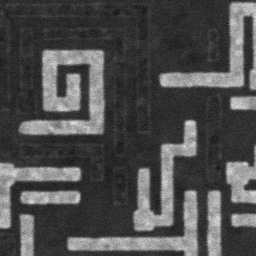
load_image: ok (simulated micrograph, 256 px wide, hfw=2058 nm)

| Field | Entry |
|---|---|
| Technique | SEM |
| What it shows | wiring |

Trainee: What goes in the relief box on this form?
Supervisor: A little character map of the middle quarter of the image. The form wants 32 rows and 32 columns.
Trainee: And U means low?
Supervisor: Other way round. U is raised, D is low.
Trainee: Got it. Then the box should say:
DDDDDDDUUDDDDDDDDDUUUDDDDDDDDDDD
DDDDDDDUUDDDDDDDDDUUUDDDDDDDDDDD
DDDDDDDUUDDDDDDDDDUUUDDDDDDUDDDD
DUUUDDDUUDDDDUUDDDUUUDDDUUUUUUUU
DUUUDDDUUDDDDUUDDDUUUDDDUUUUUUUU
DUUUDDDUUDDDDUUDDDUUUDDDDDUDDDDD
DUUUDDDUUUDDDUUDDDUUUDDDDDDDDDDD
DUUUDDDUUUDDDUUDDDUUUDDDDDDDDDDD
UUUUDDDUUUDDDUUDDDUUUDDDDDDDDDDD
UUUUDDDUUUDDDUUDDDUUUDDDDDDDDDDD
UUUUDDDUUUDDDUUDDDUUUDDDDDDDDDDD
DDDDDDDUUUDDDUUDDDUUUDDDDDDDDDDD
DDDDDDDUUUDDDUUDDDUUUDDDDDDDDDDD
DDDDDDDUUUDDDUUDDDUUUDDDDDDDDDDD
UUUUUUUUUUDDDUUDDDDUUDDDDDDDDDDD
UUUUUUUUUUDDDUUDDDDUUDDDDDDDDDUU
UUUUUUUUUUDDDUUDDDDUUDDDDDDDDDUU
DDDDDDDDDDDDDUUDDDDDDDDDDDDDDDUU
DDDDDDDDDDDDDUUDDDDDDDDDDDDDDDUU
DDDDDDDDDDDDDUUDDDDDDDDDDDDDDDUU
UUUUUUUUUDDDDUUDDDDDDDDDDUUUUUUU
UUUUUUUUUUDDDUUDDDDDDDDDUUUUUUUU
UUUUUUUUUUDDDUUDDDDDDDDDUUUUUUUU
DDDDDDUUUUDDDDDDDDDDDDDDDUUDDDDD
DDDDDDDUUUDDDDDDDDDDDDDDDUUDDDDD
DDDDDDDUUUDDDDDDDDDDDDDDDUUDDDDD
UUUUDDDUUUDDDUUUDDDUUDDDDUUDDDDD
UUUUDDDUUUDDDUUUDDDUUDDDDUUDDDDD
UUUUDDDUUUDDDUUUDDDUUDDDDUUDDDDD
DDDDDDDDDDDDDUUUDDDUUDDDDUUDDDDD
DDDDDDDDDDDDDUUUDDDUUDDDDUUDDDDD
DDDDDDDDDDDDDUUUDDDUUDDDUUUDDDDD